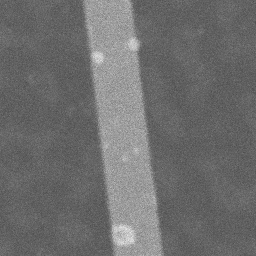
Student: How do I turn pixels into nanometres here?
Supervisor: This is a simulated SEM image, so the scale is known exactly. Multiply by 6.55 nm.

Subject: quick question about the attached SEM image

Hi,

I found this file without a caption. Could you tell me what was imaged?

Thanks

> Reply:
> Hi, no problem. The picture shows one or a few lines or trenches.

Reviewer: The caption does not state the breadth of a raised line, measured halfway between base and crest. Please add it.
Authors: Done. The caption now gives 0.299 micrometres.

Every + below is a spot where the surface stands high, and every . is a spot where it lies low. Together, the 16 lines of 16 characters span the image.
.....+++........
.....+++........
......+++.......
......+++.......
......+++.......
......+++.......
......+++.......
......+++.......
......+++.......
......+++.......
.......++.......
.......+++......
.......+++......
.......+++......
.......+++......
.......+++......